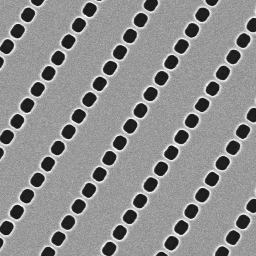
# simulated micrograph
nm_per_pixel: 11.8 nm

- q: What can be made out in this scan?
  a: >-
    a regular array of holes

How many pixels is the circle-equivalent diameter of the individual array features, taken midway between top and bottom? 14.1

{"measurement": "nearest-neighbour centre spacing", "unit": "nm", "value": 223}